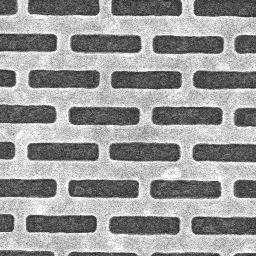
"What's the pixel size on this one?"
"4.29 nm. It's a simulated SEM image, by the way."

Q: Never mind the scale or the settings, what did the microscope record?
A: a regular array of holes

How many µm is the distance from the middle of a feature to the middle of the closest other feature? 0.233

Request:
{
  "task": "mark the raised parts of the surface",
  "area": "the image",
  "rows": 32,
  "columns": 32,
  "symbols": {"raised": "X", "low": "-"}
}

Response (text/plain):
--X---------XX---------X--------
--XX--------XX---------X--------
XXXXXXXXXXXXXXXXXXXXXXXXXXXXXXXX
XXXXXXXXXXXXXXXXXXXXXXXXXXXXXXXX
-------XX--------XXX--XXXX-XXX--
-------XX---------X---------X---
XXXX--XXXX-------XX---------XX--
XXXXXXXXXXXXXXXXXXXXXXXXXXXXXXXX
XXXXXXXXXXXXXXXXXXXXXXXXXXXXXXXX
--XX--------XX---------X--------
--XX--------XX---------X--------
XXXXXXXXXXXXXXXXXXXXXXXXXXXXXXXX
XXXXXXXXXXXXXXXXXXXXXXXXXXXXXXXX
-------XX--------XX--------XXX--
-------XX---------X---------X---
XXXXX-XXX--------XX--------XX---
XXXXXXXXXXXXXXXXXXXXXXXXXXXXXXXX
XXXXXXXXXXXXXXXXXXXXXXXXXXXXXXXX
--X---------XX--------XX--------
--X---------XX--------XX--------
XXXXXXXXXXXXXXXXXXXXXXXXXXXXXXXX
XXXXXXXXXXXXXXXXXXXXXXXXXXXXXXXX
-------XX--------XX----XXXXXXX--
-------X---------XX---------X---
-------XX--------XX--------XXX--
XXXXXXXXXXXXXXXXXXXXXXXXXXXXXXXX
XXXXXXXXXXXXXXXXXXXXXXXXXXXXXXXX
--X---------XX--------XX--------
--X---------XX--------XX--------
XXXXXXXXXXXXXXXXXXXXXXXXXXXXXXXX
XXXXXXXXXXXXXXXXXXXXXXXXXXXXXXXX
------XXX--XXXXXXXXXXX--XXXXXXXX